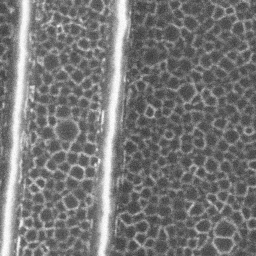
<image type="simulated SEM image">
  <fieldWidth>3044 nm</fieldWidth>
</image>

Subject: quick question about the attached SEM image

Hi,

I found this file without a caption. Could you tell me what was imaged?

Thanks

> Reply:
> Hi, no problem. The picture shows one or a few lines or trenches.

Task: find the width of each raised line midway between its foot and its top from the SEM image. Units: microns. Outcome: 1.14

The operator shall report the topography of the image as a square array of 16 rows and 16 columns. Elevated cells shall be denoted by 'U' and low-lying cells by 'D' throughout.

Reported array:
DDUUUUUUDDDDDDDD
DUUUUUUUDDDDDDDD
DUUUUUUDDDDDDDDD
DUUUUUUDDDDDDDDD
DUUUUUUDDDDDDDDD
DUUUUUUDDDDDDDDD
DUUUUUUDDDDDDDDD
DUUUUUUDDDDDDDDD
DUUUUUUDDDDDDDDD
DUUUUUUDDDDDDDDD
DUUUUUUDDDDDDDDD
DUUUUUUDDDDDDDDD
DUUUUUUDDDDDDDDD
UUUUUUUDDDDDDDDD
UUUUUUUDDDDDDDDD
UUUUUUDDDDDDDDDD